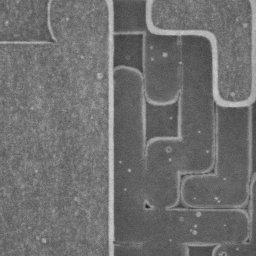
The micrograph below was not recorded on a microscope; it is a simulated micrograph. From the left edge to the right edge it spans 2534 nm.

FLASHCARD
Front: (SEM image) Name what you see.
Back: wiring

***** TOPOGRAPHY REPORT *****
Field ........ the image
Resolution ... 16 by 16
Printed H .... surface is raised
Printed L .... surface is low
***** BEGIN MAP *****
HHHHHHHLLHHHHHHH
HHHHHHHLLHHHHHHH
HHHHHHHLLLLLLHHH
HHHHHHHLLLLLLHHH
HHHHHHHLLLLLLHHH
HHHHHHHLLLLLLHHH
HHHHHHHLLLLLLLHL
HHHHHHHLLLLLLLLL
HHHHHHHLLLLLLLLL
HHHHHHHLLLLLLLLL
HHHHHHHLLLLLLLLL
HHHHHHHLLLLLLLLL
HHHHHHHLLLLLLLLL
HHHHHHHLLLLLLLLL
HHHHHHHLLLLLLLLL
HHHHHHHLLLLLLLLL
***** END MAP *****